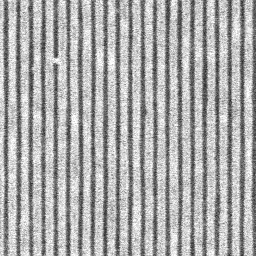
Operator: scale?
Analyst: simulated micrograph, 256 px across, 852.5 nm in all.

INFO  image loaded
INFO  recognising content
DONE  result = parallel lines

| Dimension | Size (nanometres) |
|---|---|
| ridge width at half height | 22.5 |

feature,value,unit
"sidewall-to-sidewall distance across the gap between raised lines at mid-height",19.6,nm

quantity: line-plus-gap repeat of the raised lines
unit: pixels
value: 12.4